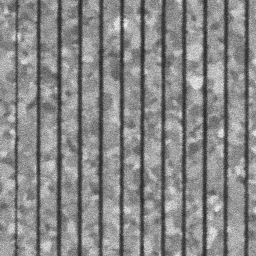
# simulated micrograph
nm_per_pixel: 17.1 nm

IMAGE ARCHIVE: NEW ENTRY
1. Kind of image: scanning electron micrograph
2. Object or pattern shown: parallel lines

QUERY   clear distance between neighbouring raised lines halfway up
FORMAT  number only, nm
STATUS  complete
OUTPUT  94.2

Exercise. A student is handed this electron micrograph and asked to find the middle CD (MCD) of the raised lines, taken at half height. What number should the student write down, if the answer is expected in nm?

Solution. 268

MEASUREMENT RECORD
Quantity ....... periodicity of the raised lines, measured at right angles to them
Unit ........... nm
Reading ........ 358